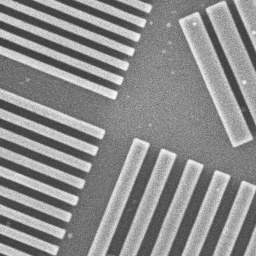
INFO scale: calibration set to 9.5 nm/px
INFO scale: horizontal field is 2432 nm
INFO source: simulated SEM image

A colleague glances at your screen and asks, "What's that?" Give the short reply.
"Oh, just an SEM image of groups of lines, slits or small figures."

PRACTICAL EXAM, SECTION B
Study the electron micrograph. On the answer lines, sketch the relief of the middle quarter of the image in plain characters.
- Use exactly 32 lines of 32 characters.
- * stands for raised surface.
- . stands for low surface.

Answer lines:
..*****.....****................
.....*****......................
**.....******...................
****.....*****..................
..*****.....**..................
....*****.......................
.......*****....................
.........****...................
............*...................
................................
................................
................................
................................
**..............................
*****...........................
.******.........................
....******......................
......****......................
***.............................
*****............***............
.*******.........****...........
....****.........****...........
*......*........****....***.....
***.............****...*****....
******.........*****...****....*
..*****........****....****....*
.....*.........****...*****...**
*.............****....****....**
****..........****....****...***
*****........*****...****....***
...**........****....****....***
............*****...*****...****